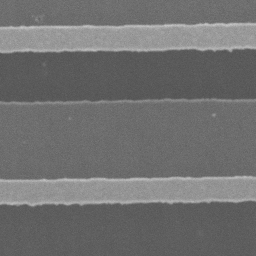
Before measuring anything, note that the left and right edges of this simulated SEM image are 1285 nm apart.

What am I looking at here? lines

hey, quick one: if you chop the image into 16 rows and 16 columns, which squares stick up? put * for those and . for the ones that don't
****************
****************
****************
................
................
................
****************
****************
****************
****************
****************
****************
****************
................
................
................